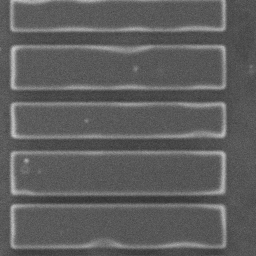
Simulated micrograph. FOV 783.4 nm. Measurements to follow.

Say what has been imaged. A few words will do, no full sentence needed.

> groups of lines, slits or small figures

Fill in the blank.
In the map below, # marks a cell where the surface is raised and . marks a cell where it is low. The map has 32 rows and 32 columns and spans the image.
.###########################....
.###########################....
.###########################....
.###########################....
................................
................................
..##########################....
..##########################....
..##########################....
..##########################....
..##########################....
................................
................................
.###########################....
..##########################....
..##########################....
..##########################....
................................
................................
.###########################....
.###########################....
.###########################....
..##########################....
..##########################....
................................
................................
.###########################....
..##########################....
..##########################....
.###########################....
.###########################....
................................